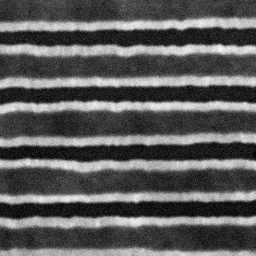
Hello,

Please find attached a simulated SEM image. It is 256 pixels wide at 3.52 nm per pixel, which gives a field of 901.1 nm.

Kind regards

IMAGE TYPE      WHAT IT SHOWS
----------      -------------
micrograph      lines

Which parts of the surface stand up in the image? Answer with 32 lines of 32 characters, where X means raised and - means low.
XXXXXXXXXXXXXXXXXXXXXXXXXXXXXXXX
XXXXXXXXXXXXXXXXXXXXXXXXXXXXXXXX
XXXXXXXXXXXXXXXXXXXXXXXXXXXXXXXX
XX----X---X---------------------
--------------------------------
--------------------------------
XXXXXXXXXXXXXXXXXXXXXXXXXXXXXXXX
XXXXXXXXXXXXXXXXXXXXXXXXXXXXXXXX
XXXXXXXXXXXXXXXXXXXXXXXXXXXXXXXX
XXXXXXXXXXXXXXXXXXXXXXXXXXXXXXXX
X--XXXX-------X-----------------
--------------------------------
--------------------------------
XXXXXXXXXXXXXXXXXXXXXXXXXXXXXXXX
XXXXXXXXXXXXXXXXXXXXXXXXXXXXXXXX
XXXXXXXXXXXXXXXXXXXXXXXXXXXXXXXX
XXXXXXXXXXXXXXXXXXXXXXXXXXXXXXXX
XXXXXXXXXXXXXXXXXXXXXXXXX------X
--------------------------------
--------------------------------
XXXXXXXXX---XXX-XXXX---XXXXXXXXX
XXXXXXXXXXXXXXXXXXXXXXXXXXXXXXXX
XXXXXXXXXXXXXXXXXXXXXXXXXXXXXXXX
XXXXXXXXXXXXXXXXXXXXXXXXXXXXXXXX
XXXXXXXXXXXXXXXXXXXXXXXXXXXXXXXX
--------------------------------
--------------------------------
-------------XX--XXX--XXXXXXXXXX
XXXXXXXXXXXXXXXXXXXXXXXXXXXXXXXX
XXXXXXXXXXXXXXXXXXXXXXXXXXXXXXXX
XXXXXXXXXXXXXXXXXXXXXXXXXXXXXXXX
XXXXXXXXXXXXXXXXXXXXXXXXXXXXXXXX